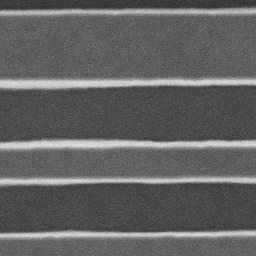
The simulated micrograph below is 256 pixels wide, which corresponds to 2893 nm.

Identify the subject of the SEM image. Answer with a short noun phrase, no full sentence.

lines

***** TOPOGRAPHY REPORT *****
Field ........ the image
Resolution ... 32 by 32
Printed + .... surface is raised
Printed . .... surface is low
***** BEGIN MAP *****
................................
........................+.....++
++++++++++++++++++++++++++++++++
++++++++++++++++++++++++++++++++
++++++++++++++++++++++++++++++++
++++++++++++++++++++++++++++++++
++++++++++++++++++++++++++++++++
++++++++++++++++++++++++++++++++
++++++++++++++++++++++++++++++++
++++++++++++++++++++++++++++++++
................................
................................
................................
................................
................................
................................
................................
................................
++++++++++++++++++++++++++++++++
++++++++++++++++++++++++++++++++
++++++++++++++++++++++++++++++++
++++++++++++++++++++++++++++++++
+++++++++++++++++++++++++.++....
................................
................................
................................
................................
................................
................................
..++++++++++++++++++++++++++++++
++++++++++++++++++++++++++++++++
++++++++++++++++++++++++++++++++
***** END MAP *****